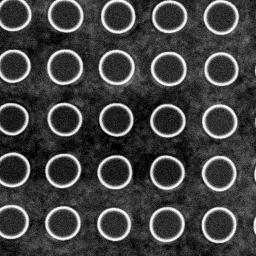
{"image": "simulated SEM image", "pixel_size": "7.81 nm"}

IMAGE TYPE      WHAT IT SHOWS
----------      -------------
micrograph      an array of small figures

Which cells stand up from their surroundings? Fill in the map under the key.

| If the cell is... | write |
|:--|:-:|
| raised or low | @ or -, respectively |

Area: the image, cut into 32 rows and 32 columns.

@@@----@@@---@@@----@@----@@@---
@@@@--@@@@---@@@@--@@@@---@@@@--
@@@@--@@@@---@@@@--@@@@---@@@@--
@@@----@@@---@@@----@@@---@@@---
--------------------------------
--------------------------------
-@@----@@-----@-----------------
@@@@--@@@@---@@@@--@@@@---@@@---
@@@@--@@@@--@@@@@--@@@@---@@@@--
@@@---@@@@---@@@---@@@@---@@@@--
-------@------@-----@@-----@----
--------------------------------
--------------------------------
@@@----@@----@@@----@@----@@@---
@@@@--@@@@---@@@@--@@@@---@@@---
@@@---@@@@---@@@@--@@@@--@@@@@--
@@@----@@----@@@----@@@---@@@---
--------------------------------
--------------------------------
@@@----@@-----------------------
@@@@--@@@@---@@@---@@@@---@@@---
@@@@--@@@@--@@@@---@@@@--@@@@@--
@@@---@@@@--@@@@---@@@@---@@@---
--------------@-----@@----@@@---
--------------------------------
--------------------------------
@@@---@@@----@@@----@@----@@@---
@@@---@@@@--@@@@---@@@@--@@@@---
@@@---@@@@--@@@@---@@@@--@@@@---
@@-----@@----@@@---@@@----@@@---
--------------------------------
--------------------------------